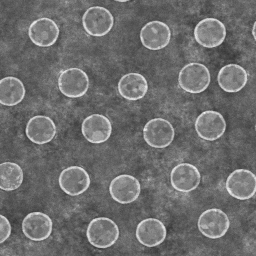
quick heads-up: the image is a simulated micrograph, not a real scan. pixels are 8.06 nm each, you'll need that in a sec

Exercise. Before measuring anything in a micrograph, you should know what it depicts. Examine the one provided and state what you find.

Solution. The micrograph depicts a regular array of raised bodies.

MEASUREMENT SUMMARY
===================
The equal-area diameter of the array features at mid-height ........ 228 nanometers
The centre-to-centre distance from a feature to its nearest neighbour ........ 414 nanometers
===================